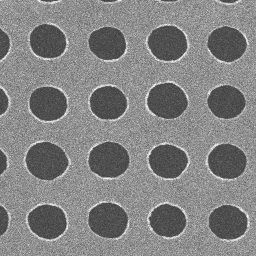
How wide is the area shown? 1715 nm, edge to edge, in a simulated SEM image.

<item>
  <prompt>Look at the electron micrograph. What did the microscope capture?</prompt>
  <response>a regular array of holes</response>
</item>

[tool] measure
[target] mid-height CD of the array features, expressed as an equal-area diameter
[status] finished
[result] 245 nm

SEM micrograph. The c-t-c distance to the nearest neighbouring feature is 392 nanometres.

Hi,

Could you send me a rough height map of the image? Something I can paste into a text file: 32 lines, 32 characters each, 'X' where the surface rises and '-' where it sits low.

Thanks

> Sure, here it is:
XXXXXXXXXXXXXXXXXXXXXXXXXXXXXXXX
XXXXXXXXXXXXXXXXXXXXXXXXXXXXXXXX
XXXXXXXXXXXXXXXXXXXXXXXXXXXXXXXX
XXXX---XXXXXX-XXXXXX--XXXXX--XXX
-XXX----XXX----XXXX----XXX----XX
-XXX----XXX-----XXX----XXX-----X
-XXX----XXXX----XXX----XXX-----X
XXXXXXXXXXXXX-XXXXXX--XXXXXX-XXX
XXXXXXXXXXXXXXXXXXXXXXXXXXXXXXXX
XXXXXXXXXXXXXXXXXXXXXXXXXXXXXXXX
XXXXXXXXXXXXXXXXXXXX--XXXXXXXXXX
-XXX----XXXX---XXXX----XXX----XX
-XXX----XXX-----XX-----XXX-----X
-XXX----XXX-----XXX----XXX-----X
XXXX----XXXX---XXXXX--XXXXX---XX
XXXXXXXXXXXXXXXXXXXXXXXXXXXXXXXX
XXXXXXXXXXXXXXXXXXXXXXXXXXXXXXXX
XXXXXXXXXXXXXXXXXXXXXXXXXXXXXXXX
XXXX----XXXX---XXXX---XXXXX---XX
-XX-----XXX-----XXX----XXX-----X
-XX-----XXX-----XXX----XXX-----X
XXXX----XXXX----XXX----XXXX---XX
XXXXX-XXXXXXXXXXXXXXXXXXXXXXXXXX
XXXXXXXXXXXXXXXXXXXXXXXXXXXXXXXX
XXXXXXXXXXXXXXXXXXXXXXXXXXXXXXXX
XXXXXXXXXXXX--XXXXXXXXXXXXXXXXXX
-XXX----XXX-----XXX----XXXX---XX
-XX-----XXX-----XXX----XXX-----X
-XXX----XXX-----XXX----XXX-----X
XXXXX--XXXXX---XXXXX--XXXXX---XX
XXXXXXXXXXXXXXXXXXXXXXXXXXXXXXXX
XXXXXXXXXXXXXXXXXXXXXXXXXXXXXXXX